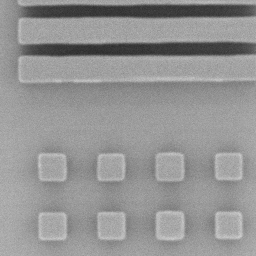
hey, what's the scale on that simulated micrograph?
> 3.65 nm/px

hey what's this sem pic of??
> groups of lines, slits or small figures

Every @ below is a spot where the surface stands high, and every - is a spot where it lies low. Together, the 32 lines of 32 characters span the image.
---@@@@@@-@@@@@@@@--------------
--------------------------------
---@@@@@@@@@@@@@@@@@@@@@@@@@@@@@
--@@@@@@@@@@@@@@@@@@@@@@@@@@@@@@
--@@@@@@@@@@@@@@@@@@@@@@@@@@@@@@
--------------------------------
--------------------------------
--@@@@@@@@@@@@@@@@@@@@@@@@@@@@@@
--@@@@@@@@@@@@@@@@@@@@@@@@@@@@@@
--@@@@@@@@@@@@@@@@@@@@@@@@@@@@@@
--------------------------------
--------------------------------
--------------------------------
--------------------------------
--------------------------------
--------------------------------
--------------------------------
--------------------------------
--------------------------------
-----@@@-----@@-----@@@----@@@--
-----@@@----@@@-----@@@----@@@--
-----@@@----@@@-----@@@----@@@--
--------------------------------
--------------------------------
--------------------------------
--------------------------------
--------------------------------
-----@@@----@@@@----@@@----@@@--
-----@@@----@@@@----@@@----@@@--
-----@@@----@@@-----@@@----@@@--
--------------------------------
--------------------------------